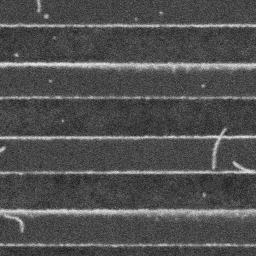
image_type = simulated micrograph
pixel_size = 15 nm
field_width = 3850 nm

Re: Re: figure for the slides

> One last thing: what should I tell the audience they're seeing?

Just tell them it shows lines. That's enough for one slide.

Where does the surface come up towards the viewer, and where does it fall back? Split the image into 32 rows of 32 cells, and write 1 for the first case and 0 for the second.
11111111111111111111111111111111
11111111111111111111111111111111
11111111111111111111111111111111
00000000000000000000000000000000
00000000000000000000000000000000
00000000000000000000000000000000
00000000000000000000000000000000
00000000000000000000000000000000
11111111111111111111111111111111
11111111111111111111111111111111
11111111111111111111111111111111
11111111111111111111111111111111
00000000000000000000000000000000
00000000000000000000000000000000
00000000000000000000000000000000
00000000000000000000000000000000
00000000000000000000000000000000
11111111111111111111111111111111
11111111111111111111111111111111
11111111111111111111111111111111
11111111111111111111111111111111
11111111111111111111111111111111
00000000000000000000000000000000
00000000000000000000000000000000
00000000000000000000000000000000
00000000000000000000000000000000
11111111111111110110000000000000
11111111111111111111111111111111
11111111111111111111111111111111
11111111111111111111111111111111
11111111111111111111111111111111
00000000000000000000000000000000